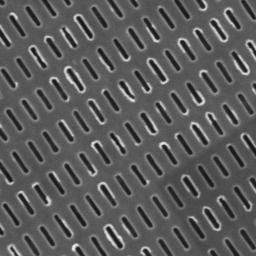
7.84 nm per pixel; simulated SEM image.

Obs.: a regular array of holes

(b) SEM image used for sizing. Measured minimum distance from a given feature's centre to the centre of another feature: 18.2 pixels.